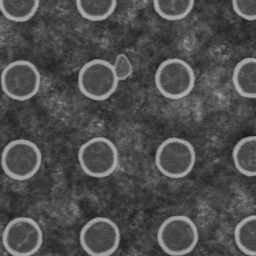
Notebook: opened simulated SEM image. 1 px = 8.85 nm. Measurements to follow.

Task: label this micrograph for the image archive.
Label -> raised bodies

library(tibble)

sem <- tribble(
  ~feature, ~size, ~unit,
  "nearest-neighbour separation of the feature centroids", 0.681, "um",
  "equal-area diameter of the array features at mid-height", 325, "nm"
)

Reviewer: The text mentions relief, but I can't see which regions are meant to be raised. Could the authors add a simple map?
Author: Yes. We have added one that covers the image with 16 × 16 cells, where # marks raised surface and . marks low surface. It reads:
##...##...##...#
................
................
................
##...##...##...#
##...##...##...#
................
................
................
##...##...##...#
##...##...##...#
................
................
................
##...##...##...#
##...##...##...#